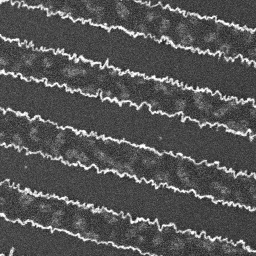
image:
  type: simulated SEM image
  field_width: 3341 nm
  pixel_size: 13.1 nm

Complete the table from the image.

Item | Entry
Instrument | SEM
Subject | one or a few lines or trenches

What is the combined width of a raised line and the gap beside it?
910 nanometers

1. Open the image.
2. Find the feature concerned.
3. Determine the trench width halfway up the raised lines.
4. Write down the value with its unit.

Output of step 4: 476 nanometres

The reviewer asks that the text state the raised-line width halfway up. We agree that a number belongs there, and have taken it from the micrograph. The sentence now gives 0.428 µm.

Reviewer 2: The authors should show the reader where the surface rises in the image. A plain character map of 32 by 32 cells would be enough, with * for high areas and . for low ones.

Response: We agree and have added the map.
...****************.............
......*****************.........
.........******************.....
.............*.****************.
..................**************
****.................***********
********.................*******
***********....................*
**************..................
..****************..............
......*****************.........
..........****************......
..............****************..
...................*************
***....................*********
*******..................*******
***********..................***
**************..................
..*****************.............
......*****************.........
........*******************.....
..............***************...
.................***************
**...................***********
*******..................*******
**********...................***
**************..................
.*****************..............
......****************..........
..........****************......
..............*****************.
..................**************